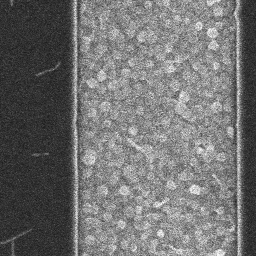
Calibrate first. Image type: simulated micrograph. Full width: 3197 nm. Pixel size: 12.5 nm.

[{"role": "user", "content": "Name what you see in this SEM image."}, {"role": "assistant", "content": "one or a few lines or trenches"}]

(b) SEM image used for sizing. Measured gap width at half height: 2020 nm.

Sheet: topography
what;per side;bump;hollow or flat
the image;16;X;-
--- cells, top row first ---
XXXXX----------X
XXXXX----------X
XXXXX----------X
XXXXX----------X
XXXXX----------X
XXXXX----------X
XXXXX----------X
XXXXX----------X
XXXXX----------X
XXXXX----------X
XXXXX----------X
XXXXX----------X
XXXXX----------X
XXXXX----------X
XXXXX----------X
XXXXX----------X